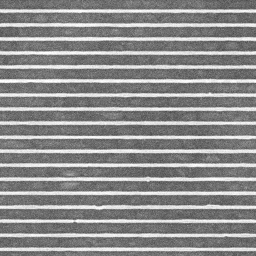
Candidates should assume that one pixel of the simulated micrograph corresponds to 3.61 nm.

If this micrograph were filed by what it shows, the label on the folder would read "parallel lines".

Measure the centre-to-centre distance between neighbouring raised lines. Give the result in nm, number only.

50.6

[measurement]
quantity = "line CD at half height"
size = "9.5 nm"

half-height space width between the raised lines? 11.4 pixels